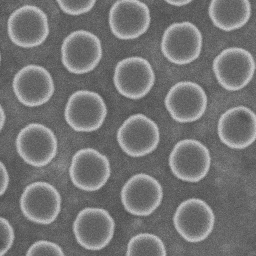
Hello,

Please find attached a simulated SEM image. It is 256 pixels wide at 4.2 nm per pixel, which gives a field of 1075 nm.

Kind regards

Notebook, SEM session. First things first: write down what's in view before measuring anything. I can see a regular array of raised bodies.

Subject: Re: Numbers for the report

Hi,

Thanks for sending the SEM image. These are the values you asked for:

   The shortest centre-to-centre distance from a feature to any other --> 57.9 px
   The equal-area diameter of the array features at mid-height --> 168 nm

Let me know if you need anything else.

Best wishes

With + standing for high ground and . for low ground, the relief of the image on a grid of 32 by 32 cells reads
.......+++++..++++....+...+++++.
..+++...++....++++........+++++.
.+++++........+++++........++++.
.+++++........++++...+++....+...
.+++++...+++...++....++++.......
..+++...++++........+++++.......
........+++++.......+++++...+++.
........++++....++...+++...+++++
...++...++++...++++........+++++
..++++........+++++........++++.
..+++++.......+++++...++....+++.
..+++++...+....+++...++++.......
...+++...++++........+++++......
........+++++........+++++....+.
........+++++....+....+++...++++
.........++++..++++........+++++
...+++.........+++++.......+++++
..+++++........+++++........++++
..+++++........++++...++++......
...++++..++++........+++++......
....++...+++++.......+++++......
+........+++++........++++......
+........++++...+++....++.......
+..++++...++...+++++............
...++++........+++++............
...++++.........++++...+++......
...++++...+++...+++...++++......
+...+++...++++........+++++.....
+........+++++........++++......
++........++++...++....+++......
+...+++...+++...++++............
+...++++........+++++...........